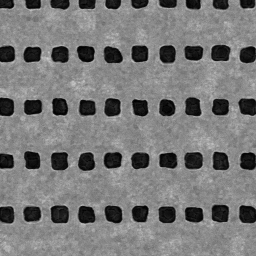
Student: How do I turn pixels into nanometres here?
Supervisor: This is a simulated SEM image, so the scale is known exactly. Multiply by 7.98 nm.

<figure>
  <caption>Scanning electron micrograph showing a regular array of holes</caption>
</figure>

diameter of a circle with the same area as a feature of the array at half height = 18.3 px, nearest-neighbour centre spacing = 210 nanometres